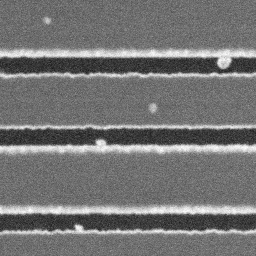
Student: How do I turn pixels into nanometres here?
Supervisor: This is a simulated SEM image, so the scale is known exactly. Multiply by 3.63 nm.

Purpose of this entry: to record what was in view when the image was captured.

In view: lines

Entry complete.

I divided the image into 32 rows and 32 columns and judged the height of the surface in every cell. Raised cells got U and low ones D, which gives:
UUUUUUUUUUUUUUUUUUUUUUUUUUUUUUUU
UUUUUUUUUUUUUUUUUUUUUUUUUUUUUUUU
UUUUUUUUUUUUUUUUUUUUUUUUUUUUUUUU
UUUUUUUUUUUUUUUUUUUUUUUUUUUUUUUU
UUUUUUUUUUUUUUUUUUUUUUUUUUUUUUUU
UUUUUUUUUUUUUUUUUUUUUUUUUUUUUUUU
UUUUUUUUUUUUUUUUUUUUUUUUUUUUUUUU
DDDDDDDDDDDDDDDDDDDDDDDDDDDDDDDD
DDDDDDDDDDDDDDDDDDDDDDDDDDDDDDDD
UUUUUUUUUUUUUUUUUUUUUUUUUUUUUUUU
UUUUUUUUUUUUUUUUUUUUUUUUUUUUUUUU
UUUUUUUUUUUUUUUUUUUUUUUUUUUUUUUU
UUUUUUUUUUUUUUUUUUUUUUUUUUUUUUUU
UUUUUUUUUUUUUUUUUUUUUUUUUUUUUUUU
UUUUUUUUUUUUUUUUUUUUUUUUUUUUUUUU
UUUUUUUUUUUUUUUUUUUUUUUUUUUUUUUU
DDDDDDDDDDDDDDDDDDDDDDDDDDDDDDDD
DDDDDDDDDDDDDDDDDDDDDDDDDDDDDDDD
DDUUUUUUUUUUUUUUUUUUUUUUUUUUUUUU
UUUUUUUUUUUUUUUUUUUUUUUUUUUUUUUU
UUUUUUUUUUUUUUUUUUUUUUUUUUUUUUUU
UUUUUUUUUUUUUUUUUUUUUUUUUUUUUUUU
UUUUUUUUUUUUUUUUUUUUUUUUUUUUUUUU
UUUUUUUUUUUUUUUUUUUUUUUUUUUUUUUU
UUUUUUUUUUUUUUUUUUUUUUUUUUUUUUUU
UUUUUUUUUUUUUUUUUUUUUUUUUUUUUUUU
DDDDDDDDDDDDDDDDDDDDDDDDDDDDDDDD
DDDDDDDDDDDDDDDDDDDDDDDDDDDDDDDD
DDDDDDDDDDDDDDDDDDDDDDDDDDDDDDDD
UUUUUUUUUUUUUUUUUUUUUUUUUUUUUUUU
UUUUUUUUUUUUUUUUUUUUUUUUUUUUUUUU
UUUUUUUUUUUUUUUUUUUUUUUUUUUUUUUU